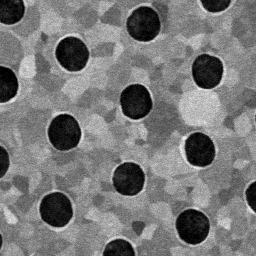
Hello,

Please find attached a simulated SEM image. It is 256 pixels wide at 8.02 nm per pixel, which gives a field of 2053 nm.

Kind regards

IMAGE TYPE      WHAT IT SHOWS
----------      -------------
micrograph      a regular array of holes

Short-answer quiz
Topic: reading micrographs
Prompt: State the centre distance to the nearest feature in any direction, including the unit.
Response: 617 nm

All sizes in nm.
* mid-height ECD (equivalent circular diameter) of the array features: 282